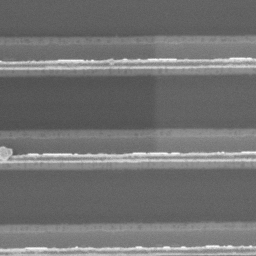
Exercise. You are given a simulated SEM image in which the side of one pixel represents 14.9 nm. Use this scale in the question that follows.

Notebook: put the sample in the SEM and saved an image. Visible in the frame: lines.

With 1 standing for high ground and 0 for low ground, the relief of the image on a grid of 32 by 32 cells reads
00000000000000000000000000000000
00000000000000000000000000000000
00000000000000000000000000000000
00000000000000000000000000000000
00000000000000000000000000000000
11111111111111111111111111111111
11111111111111111111111111111111
11111111111111111111111111111111
11111111111111111111111111111111
00000000000000000000000000000000
00000000000000000000000000000000
00000000000000000000000000000000
00000000000000000000000000000000
00000000000000000000000000000000
00000000000000000000000000000000
00000000000000000000000000000000
00000000000000000000000000000000
11111111111111111111111111111111
11111111111111111111111111111111
11111111111111111111111111111111
10000000000000000000000000000000
00000000000000000000000000000000
00000000000000000000000000000000
00000000000000000000000000000000
00000000000000000000000000000000
00000000000000000000000000000000
00000000000000000000000000000000
00000000000000000000000000000000
00000000000000000000000000000000
11111111111111111111111111111111
11111111111111111111111111111111
11111111111111111111111111111111